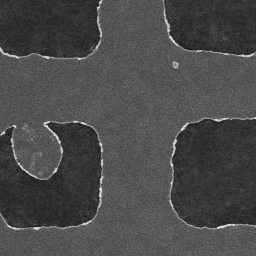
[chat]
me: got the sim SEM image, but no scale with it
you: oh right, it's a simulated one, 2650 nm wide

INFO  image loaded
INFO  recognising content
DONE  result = holes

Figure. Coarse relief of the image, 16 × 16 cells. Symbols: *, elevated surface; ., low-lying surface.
......****......
......*****.....
......*****.....
*.*..***********
****************
****************
****************
**************..
.***..*****.....
.***..*****.....
.***..*****.....
......*****.....
......*****.....
......*****.....
****************
****************